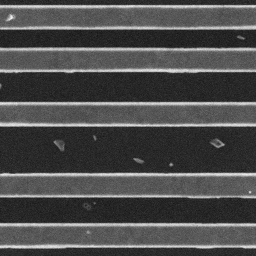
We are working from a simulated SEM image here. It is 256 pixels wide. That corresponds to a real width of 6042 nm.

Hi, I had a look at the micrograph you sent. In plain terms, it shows lines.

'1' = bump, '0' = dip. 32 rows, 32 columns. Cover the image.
00000000000000000000000000000000
11111111111111111111111111111111
11111111111111111111111111111111
11111111111111111111111111111111
00000000000000000000000000000000
00000000000000000000000000000000
11111111111111111111111111111111
11111111111111111111111111111111
11111111111111111111111111111111
00000000000000000000000000000000
00000000000000000000000000000000
00000000000000000000000000000000
00000000000000000000000000000000
11111111111111111111111111111111
11111111111111111111111111111111
11111111111111111111111111111111
00000000000000000000000000000000
00000000000000000000000000000000
00000000000000000000000000000000
00000000000000000000000000000000
00000000000000000000000000000000
00000000000000000000000000000000
11111111111111111111111111111111
11111111111111111111111111111111
11111111111111111111111111111111
00000000000000000000000000000000
00000000000000000000000000000000
00000000000000000000000000000000
11111111111111111111111111111111
11111111111111111111111111111111
11111111111111111111111111111111
00000000000000000000000000000000